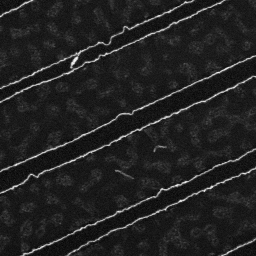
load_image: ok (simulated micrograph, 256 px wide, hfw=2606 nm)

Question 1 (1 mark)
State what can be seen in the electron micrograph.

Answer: one or a few lines or trenches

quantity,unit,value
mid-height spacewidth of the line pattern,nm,660